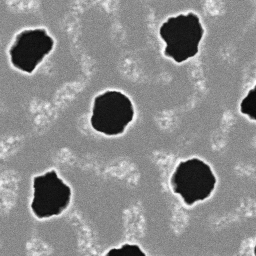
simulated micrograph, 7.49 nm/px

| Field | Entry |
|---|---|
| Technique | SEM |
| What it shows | holes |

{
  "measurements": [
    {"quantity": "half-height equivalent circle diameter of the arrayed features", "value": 315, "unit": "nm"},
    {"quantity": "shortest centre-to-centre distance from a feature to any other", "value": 772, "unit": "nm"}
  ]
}